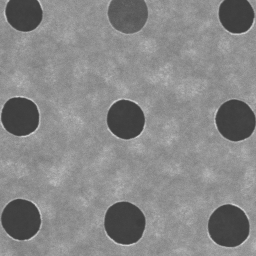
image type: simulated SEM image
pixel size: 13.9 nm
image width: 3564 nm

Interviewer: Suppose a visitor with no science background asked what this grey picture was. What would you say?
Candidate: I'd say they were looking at holes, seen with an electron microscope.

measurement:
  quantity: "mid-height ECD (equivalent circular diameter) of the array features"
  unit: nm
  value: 566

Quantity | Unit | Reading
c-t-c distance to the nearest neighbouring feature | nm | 1440